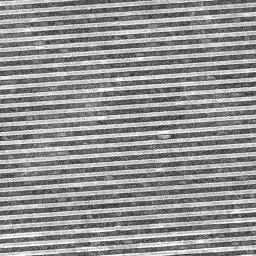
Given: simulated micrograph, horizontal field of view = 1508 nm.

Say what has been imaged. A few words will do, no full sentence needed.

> parallel lines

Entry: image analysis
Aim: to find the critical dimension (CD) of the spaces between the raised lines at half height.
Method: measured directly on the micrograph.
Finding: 34.5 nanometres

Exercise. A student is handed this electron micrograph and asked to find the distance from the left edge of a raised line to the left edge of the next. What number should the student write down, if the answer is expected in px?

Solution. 9.3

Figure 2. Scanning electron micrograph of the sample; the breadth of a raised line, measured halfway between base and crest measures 20.6 nanometres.